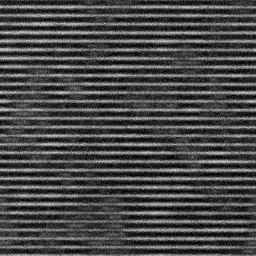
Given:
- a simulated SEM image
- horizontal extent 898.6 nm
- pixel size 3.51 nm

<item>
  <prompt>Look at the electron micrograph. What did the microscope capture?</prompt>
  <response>parallel lines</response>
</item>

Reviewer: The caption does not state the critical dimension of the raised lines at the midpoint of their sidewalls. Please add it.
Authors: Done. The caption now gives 4.8 nm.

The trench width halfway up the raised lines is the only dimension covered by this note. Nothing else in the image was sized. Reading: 24.1 nanometres